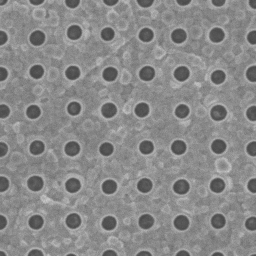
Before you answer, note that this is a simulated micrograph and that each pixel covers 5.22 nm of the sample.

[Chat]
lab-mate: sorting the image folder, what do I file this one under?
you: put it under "a regular array of holes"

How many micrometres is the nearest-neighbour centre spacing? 0.184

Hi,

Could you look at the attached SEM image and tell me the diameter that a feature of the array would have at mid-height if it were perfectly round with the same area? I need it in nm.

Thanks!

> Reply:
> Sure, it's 85.2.